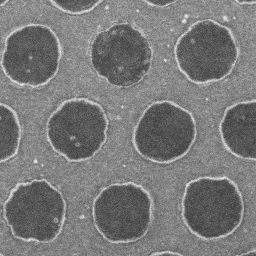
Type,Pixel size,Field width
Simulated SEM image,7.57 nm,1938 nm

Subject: raised bodies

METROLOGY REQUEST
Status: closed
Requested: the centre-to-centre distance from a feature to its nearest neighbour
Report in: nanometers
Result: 660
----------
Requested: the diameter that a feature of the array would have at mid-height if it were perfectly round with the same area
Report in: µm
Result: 0.463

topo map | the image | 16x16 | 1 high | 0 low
0000110000000000
0000000000001100
1111000000011110
1111000000011110
1111000000011100
0000000000000000
0000110000100001
1001111001110011
1001111011110011
1000110001110001
0000000000000000
0110000000001110
1111001110011110
1111001110011110
0111001110001100
0000000000000000